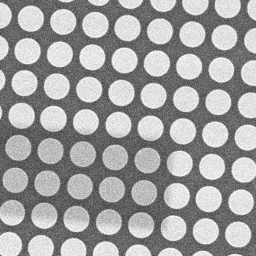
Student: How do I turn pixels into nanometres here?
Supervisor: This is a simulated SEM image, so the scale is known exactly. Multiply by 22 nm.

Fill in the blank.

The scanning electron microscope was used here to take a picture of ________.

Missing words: an array of small figures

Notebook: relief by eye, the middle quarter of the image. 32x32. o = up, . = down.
.....oooo...oooooo..oooooo..oooo
.............oooo...oooooo..oooo
.....................oooo....ooo
o....oo.......................oo
o...ooooo....ooo................
o..oooooo...ooooo...oooo........
o..oooooo..oooooo...ooooo...oooo
o..oooooo..oooooo..oooooo...oooo
....ooooo..oooooo..oooooo..ooooo
............ooooo...ooooo...oooo
.....................ooo....oooo
.....o.......................ooo
...ooooo....ooo.................
...ooooo...ooooo....ooo.........
..oooooo...oooooo..ooooo....oooo
...ooooo...oooooo..oooooo..ooooo
...ooooo...oooooo..oooooo..ooooo
.....o.....ooooo...ooooo...ooooo
....................oooo...ooooo
....o.......................ooo.
..ooooo.....oo..................
..oooooo..ooooo....oooo.........
..oooooo..oooooo..ooooo....oooo.
..oooooo..oooooo..oooooo..oooooo
..ooooo...oooooo..oooooo..oooooo
....oo.....oooo...oooooo..oooooo
...................oooo...oooooo
...........................oooo.
..oooo.....oo...................
.oooooo..ooooo....ooo...........
.oooooo..oooooo...ooooo...oooo..
.oooooo..oooooo..oooooo..oooooo.